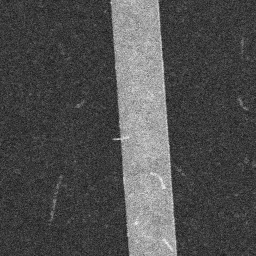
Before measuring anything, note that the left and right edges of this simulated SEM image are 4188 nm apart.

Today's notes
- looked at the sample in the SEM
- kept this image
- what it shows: one or a few lines or trenches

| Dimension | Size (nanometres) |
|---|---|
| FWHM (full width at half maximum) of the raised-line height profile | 769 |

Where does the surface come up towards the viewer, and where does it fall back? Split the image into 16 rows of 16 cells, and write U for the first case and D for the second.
DDDDDDDUUUDDDDDD
DDDDDDDUUUDDDDDD
DDDDDDDUUUDDDDDD
DDDDDDDUUUDDDDDD
DDDDDDDUUUDDDDDD
DDDDDDDUUUDDDDDD
DDDDDDDUUUDDDDDD
DDDDDDDUUUDDDDDD
DDDDDDDDUUDDDDDD
DDDDDDDDUUUDDDDD
DDDDDDDDUUUDDDDD
DDDDDDDDUUUDDDDD
DDDDDDDDUUUDDDDD
DDDDDDDDUUUDDDDD
DDDDDDDDUUUDDDDD
DDDDDDDDUUUDDDDD